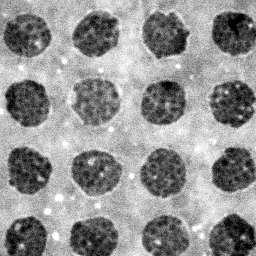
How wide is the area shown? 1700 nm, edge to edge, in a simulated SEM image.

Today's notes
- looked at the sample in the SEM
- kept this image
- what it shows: a regular array of raised bodies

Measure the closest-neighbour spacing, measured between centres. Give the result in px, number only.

67.4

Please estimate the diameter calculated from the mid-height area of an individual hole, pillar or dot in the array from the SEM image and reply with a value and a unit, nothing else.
321 nanometres